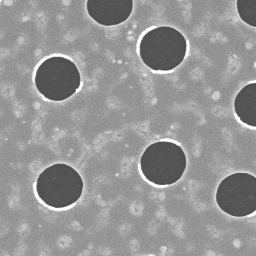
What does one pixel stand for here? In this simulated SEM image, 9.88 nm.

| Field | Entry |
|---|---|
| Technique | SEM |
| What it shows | holes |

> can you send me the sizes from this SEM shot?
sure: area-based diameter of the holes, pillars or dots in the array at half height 0.446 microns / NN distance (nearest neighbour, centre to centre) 1050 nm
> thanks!